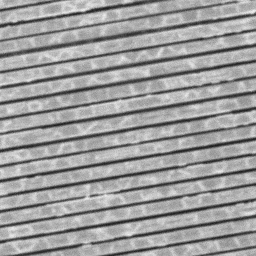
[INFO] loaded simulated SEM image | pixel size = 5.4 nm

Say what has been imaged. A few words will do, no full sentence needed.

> parallel lines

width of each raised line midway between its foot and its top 61.2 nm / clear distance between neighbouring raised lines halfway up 18.6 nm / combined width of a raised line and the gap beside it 82.7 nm